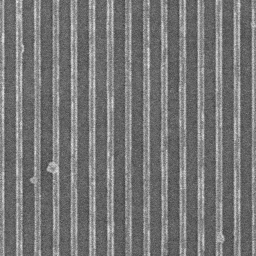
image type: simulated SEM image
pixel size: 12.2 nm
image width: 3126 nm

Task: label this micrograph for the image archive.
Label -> parallel lines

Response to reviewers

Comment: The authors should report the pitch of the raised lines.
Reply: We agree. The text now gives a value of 221 nanometers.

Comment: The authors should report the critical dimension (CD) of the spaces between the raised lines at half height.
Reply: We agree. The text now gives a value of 154 nm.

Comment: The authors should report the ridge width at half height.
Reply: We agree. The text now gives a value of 65.6 nanometers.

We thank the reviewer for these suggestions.